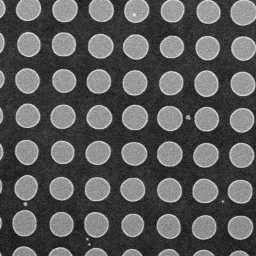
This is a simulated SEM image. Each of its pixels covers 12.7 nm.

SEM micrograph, an array of small figures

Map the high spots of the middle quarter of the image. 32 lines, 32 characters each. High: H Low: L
LLLLLLLLLLLLLLLLLLLLLLLLLLLLLLLL
HLLLLLLLHLLLLLLLLLLLLLLLLLLLLLLL
HHLLLLHHHHHLLLLLHHHHLLLLLHHHHLLL
HHHLLLHHHHHHLLLHHHHHLLLLHHHHHHLL
HHHLLLHHHHHHLLLHHHHHHLLLHHHHHHLL
HHHLLLHHHHHLLLLHHHHHHLLLHHHHHHLL
HHLLLLLHHHHLLLLHHHHHLLLLHHHHHLLL
LLLLLLLLLLLLLLLLHHHLLLLLLHHHLLLL
LLLLLLLLLLLLLLLLLLLLLLLLLLLLLLLL
LLLLLLLLLLLLLLLLLLLLLLLLLLLLLLLL
HLLLLLLLHLLLLLLLLHHLLLLLLLLLLLLL
HHLLLLLHHHHLLLLHHHHHLLLLHHHHHLLL
HHHLLLHHHHHHLLLHHHHHHLLLHHHHHLLL
HHHLLLHHHHHHLLLHHHHHHLLHHHHHHLLL
HHLLLLHHHHHHLLLHHHHHHLLLHHHHHLLL
HHLLLLLHHHHLLLLHHHHHLLLLHHHHHLLL
LLLLLLLLLLLLLLLLLLLLLLLLLLHHLLLL
LLLLLLLLLLLLLLLLLLLLLLLLLLLLLLLL
LLLLLLLLLLLLLLLLLLLLLLLLLLLLLLLL
HLLLLLLLHHLLLLLLLLLLLLLLLLLLLLLL
HHLLLLHHHHHLLLLHHHHHLLLLHHHHHLLL
HHLLLLHHHHHHLLLHHHHHHLLLHHHHHLLL
HHLLLLHHHHHHLLLHHHHHHLLHHHHHHLLL
HHLLLLHHHHHLLLLHHHHHLLLHHHHHHLLL
HLLLLLHHHHLLLLLHHHHHLLLLHHHHHLLL
LLLLLLLLLLLLLLLLLLLLLLLLLLLLLLLL
LLLLLLLLLLLLLLLLLLLLLLLLLLLLLLLL
LLLLLLLLLLLLLLLLLLLLLLLLLLLLLLLL
LLLLLLLHHLLLLLLLLLLLLLLLLLLLLLLL
HHLLLLHHHHHLLLLHHHHHLLLLHHHHLLLL
HHLLLHHHHHHLLLHHHHHHLLLLHHHHHLLL
HHLLLHHHHHHLLLHHHHHHLLLLHHHHHLLL